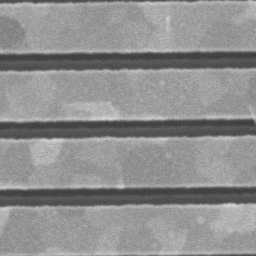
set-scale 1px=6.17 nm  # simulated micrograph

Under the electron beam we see lines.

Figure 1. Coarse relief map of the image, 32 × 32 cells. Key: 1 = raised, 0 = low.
10110111111111111111111111111111
11111111111111111111111111111111
11111111111111111111111111111111
11111111111111111111111111111111
11111111111111111111111111111111
11111111111111111111111111111111
11111111111111111101100000000000
00000000000000000000000000000000
00000000000000000000000000000000
11111111111111111111111111111111
11111111111111111111111111111111
11111111111111111111111111111111
11111111111111111111111111111111
11111111111111111111111111111111
11111111111111111111111111111111
00000000000000000000000000000000
00000000000000000000000000000000
11111111111111111111111111111111
11111111111111111111111111111111
11111111111111111111111111111111
11111111111111111111111111111111
11111111111111111111111111111111
11111111111111111111111111111111
11111111000000010000000000000000
00000000000000000000000000000000
00000000000000000000000000001111
11111111111111111111111111111111
11111111111111111111111111111111
11111111111111111111111111111111
11111111111111111111111111111111
11111111111111111111111111111111
11111111111111111111111111111111